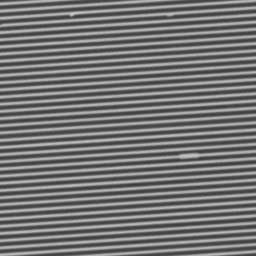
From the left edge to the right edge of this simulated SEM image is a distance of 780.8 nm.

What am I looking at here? parallel lines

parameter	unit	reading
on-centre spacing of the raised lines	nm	21.9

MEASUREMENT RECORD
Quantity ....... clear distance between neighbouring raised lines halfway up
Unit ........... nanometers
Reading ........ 11.4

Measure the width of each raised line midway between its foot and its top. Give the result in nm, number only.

11